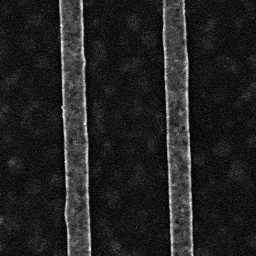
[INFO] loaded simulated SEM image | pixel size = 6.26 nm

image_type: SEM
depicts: one or a few lines or trenches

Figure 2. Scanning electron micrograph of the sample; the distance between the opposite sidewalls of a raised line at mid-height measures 136 nm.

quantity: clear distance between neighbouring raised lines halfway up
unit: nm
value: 508